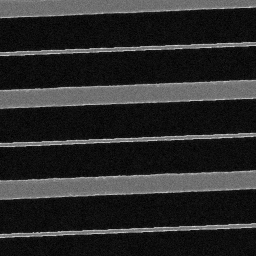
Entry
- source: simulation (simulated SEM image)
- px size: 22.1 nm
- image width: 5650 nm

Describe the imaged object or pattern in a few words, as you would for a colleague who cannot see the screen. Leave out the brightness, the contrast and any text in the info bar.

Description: lines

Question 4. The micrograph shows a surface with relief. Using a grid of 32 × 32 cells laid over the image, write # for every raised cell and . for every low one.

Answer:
################################
#################...............
................................
................................
................................
................................
................................
................................
................................
................................
....................############
################################
##########################......
................................
................................
................................
................................
................................
................................
................................
................................
.............................###
....############################
################################
########........................
................................
................................
................................
................................
................................
................................
................................